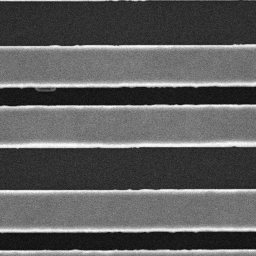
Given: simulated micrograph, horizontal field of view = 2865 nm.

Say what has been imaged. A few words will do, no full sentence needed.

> lines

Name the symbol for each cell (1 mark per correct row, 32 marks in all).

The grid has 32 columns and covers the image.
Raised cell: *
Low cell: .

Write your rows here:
................................
................................
................................
................................
................................
................................
********************************
********************************
********************************
********************************
********************************
................................
................................
********************************
********************************
********************************
********************************
********************************
................................
................................
................................
................................
................................
................................
********************************
********************************
********************************
********************************
********************************
................................
................................
********************************